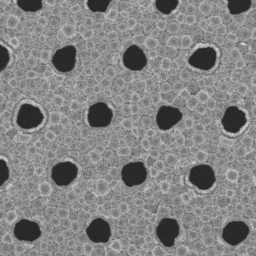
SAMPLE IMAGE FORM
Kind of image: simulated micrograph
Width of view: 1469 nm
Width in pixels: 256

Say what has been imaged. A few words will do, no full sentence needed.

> a regular array of holes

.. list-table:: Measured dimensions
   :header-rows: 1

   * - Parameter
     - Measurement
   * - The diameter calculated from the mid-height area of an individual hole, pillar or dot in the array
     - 144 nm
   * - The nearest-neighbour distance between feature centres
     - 66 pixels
